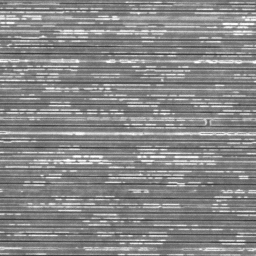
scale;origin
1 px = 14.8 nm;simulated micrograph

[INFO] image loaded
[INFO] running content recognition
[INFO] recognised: parallel lines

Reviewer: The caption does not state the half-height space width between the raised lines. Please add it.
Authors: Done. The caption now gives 27.7 nanometers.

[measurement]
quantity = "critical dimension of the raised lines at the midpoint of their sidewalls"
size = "83.1 nm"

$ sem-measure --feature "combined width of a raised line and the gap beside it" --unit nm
107